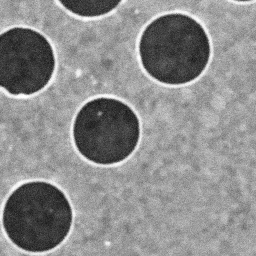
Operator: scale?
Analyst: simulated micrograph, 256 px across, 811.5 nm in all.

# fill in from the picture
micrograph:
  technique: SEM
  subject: holes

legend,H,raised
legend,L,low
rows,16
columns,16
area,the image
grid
HHHHLLLHHHHHHHHH
HHHHHHHHHLLLHHHH
LLLHHHHHHLLLLHHH
LLLHHHHHHLLLLHHH
LLLHHHHHHLLLLHHH
LLLHHHHHHHHHHHHH
HHHHHLLLHHHHHHHH
HHHHHLLLLHHHHHHH
HHHHHLLLLHHHHHHH
HHHHHLLLHHHHHHHH
HHHHHHHHHHHHHHHH
HLLHHHHHHHHHHHHH
LLLLHHHHHHHHHHHH
LLLLLHHHHHHHHHHH
LLLLHHHHHHHHHHHH
HLLHHHHHHHHHHHHH